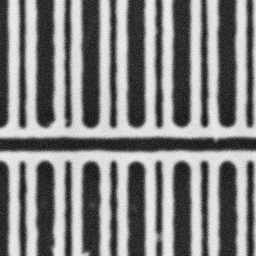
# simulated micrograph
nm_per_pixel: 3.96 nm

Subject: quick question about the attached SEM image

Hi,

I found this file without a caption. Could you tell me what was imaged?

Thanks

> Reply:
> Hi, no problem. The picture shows groups of lines, slits or small figures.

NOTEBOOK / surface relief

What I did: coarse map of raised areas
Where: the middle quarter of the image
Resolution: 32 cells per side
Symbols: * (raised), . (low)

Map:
..**.....**..***.....*...**.....
..**.....**..***.....**..**.....
..**.....**..***.....**..**.....
..**.....**..***.....**..**.....
..**.....**..***.....**..**.....
..**.....**..***.....**..**.....
..**.....**..***.....**..**.....
..**.....**...**.....**..**.....
..**.....**...**.....**..**.....
..**.....**..***.....**..**.....
..**.....**..***.....**..**.....
..***....**..***.....*...**.....
..***....**...**.....**..**.....
..**.....**..***.....**..**.....
*.***....**..***....***..**.....
..***...****.****...***..***...*
********************************
********************************
................................
................................
................................
................................
********************************
********************************
..***...****.****..****..***...*
..***....**...**....***..**.....
..**.....**...**.....**..**.....
..**.....**...**.....**..**.....
..**.....**...**.....**..**.....
..**.....**...**.....**..**.....
..**.....**...**.....**..**.....
..**.....**..***.....**..**.....